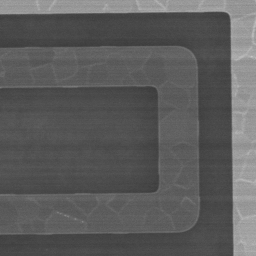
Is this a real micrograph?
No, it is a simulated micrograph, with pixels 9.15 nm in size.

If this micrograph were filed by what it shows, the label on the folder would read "groups of lines, slits or small figures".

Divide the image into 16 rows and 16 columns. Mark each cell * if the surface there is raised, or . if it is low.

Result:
****************
..............**
..............**
************..**
************..**
..........**..**
..........**...*
..........**...*
..........**...*
..........**...*
..........**...*
..........**...*
************...*
************...*
*********......*
...............*